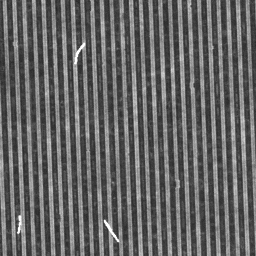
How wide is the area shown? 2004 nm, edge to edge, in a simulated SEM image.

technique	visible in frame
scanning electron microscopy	parallel lines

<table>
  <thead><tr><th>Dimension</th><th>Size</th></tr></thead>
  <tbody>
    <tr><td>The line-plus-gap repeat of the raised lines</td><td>76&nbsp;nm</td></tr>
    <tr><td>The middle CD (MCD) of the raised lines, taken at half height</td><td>26.4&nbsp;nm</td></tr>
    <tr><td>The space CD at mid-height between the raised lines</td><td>51.8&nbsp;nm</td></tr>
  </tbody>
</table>